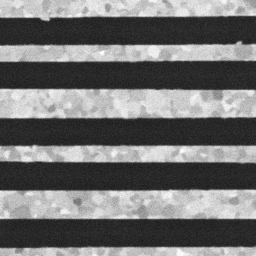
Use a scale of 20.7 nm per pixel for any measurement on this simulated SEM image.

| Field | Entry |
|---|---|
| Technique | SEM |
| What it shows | lines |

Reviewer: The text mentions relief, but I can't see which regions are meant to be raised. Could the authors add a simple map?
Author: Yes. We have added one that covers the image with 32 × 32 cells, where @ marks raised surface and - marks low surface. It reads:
@@@@@@@@@@@@@@@@@@@@@@@@@@@@@@@@
@@@@@@@@@@@@@@@@@@@@@@@@@@@@@@@@
--------------------------------
--------------------------------
--------------------------------
-----------------------------@--
@@@@@@@@@@@@@@@@@@@@@@@@@@@@@@@@
@@@@@@@@@@@@@@@@@@@@@@@@@@@@@@@@
--------------------------------
--------------------------------
--------------------------------
@@@@@@@@@@@@@@@@@@@@@@@@@@@@@@@@
@@@@@@@@@@@@@@@@@@@@@@@@@@@@@@@@
@@@@@@@@@@@@@@@@@@@@@@@@@@@@@@@@
@@@@@@@@@@@@@@@@@@@@@@@@@@@@@@@@
--------------------------------
--------------------------------
--------------------------------
@@@@@@@@@@@@@@@@@@@@@@@@@@@@@@@@
@@@@@@@@@@@@@@@@@@@@@@@@@@@@@@@@
--------------------------------
--------------------------------
--------------------------------
--------------------------------
@@@@@@@@@@@@@@@@@@@@@@@@@@@@@@@@
@@@@@@@@@@@@@@@@@@@@@@@@@@@@@@@@
@@@@@@@@@@@@@@@@@@@@@@@@@@@@@@@@
--------------------------------
--------------------------------
--------------------------------
--------------------------------
@@@@@@@@@@@@@@@@@@@@@@@@@@@@@@@@